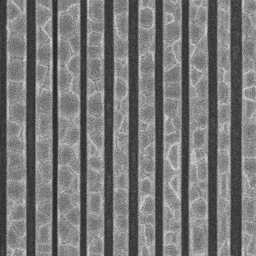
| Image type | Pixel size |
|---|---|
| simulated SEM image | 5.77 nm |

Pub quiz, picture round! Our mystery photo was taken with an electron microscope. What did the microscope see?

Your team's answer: parallel lines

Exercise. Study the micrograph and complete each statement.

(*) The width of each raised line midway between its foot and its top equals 0.101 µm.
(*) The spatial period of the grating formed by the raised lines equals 149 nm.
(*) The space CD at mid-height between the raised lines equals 8.39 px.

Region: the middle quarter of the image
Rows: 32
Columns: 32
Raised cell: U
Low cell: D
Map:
UUUUDDUUUUDDDUUUDDDUUUUDDUUUUDDU
UUUUDDUUUUDDDUUUDDDUUUUDDUUUUDDU
UUUUDDUUUUDDDUUUDDDUUUUDDUUUUDDU
UUUUDDUUUUDDDUUUDDDUUUUDDUUUUDDU
UUUUDDUUUUDDUUUUDDDUUUUDDUUUUDDU
UUUUDDUUUUDDUUUUDDDUUUUDDUUUUDDU
UUUUDDUUUUDDUUUUDDDUUUUDDUUUUDDU
UUUUDDUUUUDDUUUUDDDUUUUDDUUUUDDU
UUUUDDUUUUDDUUUUDDDUUUUDDUUUUDDU
UUUUDDUUUUDDUUUUDDDUUUUDDUUUUDDU
UUUUDDUUUUDDUUUUDDDUUUUDDUUUUDDU
UUUUDDUUUUDDUUUUDDDUUUUDDUUUUDDU
UUUUDDUUUUDDUUUUDDDUUUUDDUUUUDDD
UUUUDDUUUUDDUUUUDDDUUUUDDUUUUDDD
UUUUDDUUUUDDUUUUDDDUUUUDDUUUUDDD
UUUUDDUUUUDDUUUUDDDUUUUDDUUUUDDD
UUUUDDUUUUDDUUUUDDDUUUUDDUUUUDDD
UUUUDDUUUUDDUUUUDDDUUUUDDUUUUDDD
UUUUDDUUUUDDUUUUDDDUUUUDDUUUUDDD
UUUUDDUUUUDDUUUUDDDUUUUDDUUUUDDU
UUUUDDUUUUDDUUUUDDDUUUUDDUUUUDDU
UUUUDDUUUUDDUUUUDDDUUUUDDUUUUDDU
UUUUDDUUUUDDUUUUDDDUUUUDDUUUUDDU
UUUUDDUUUUDDUUUUDDDUUUUDDUUUUDDU
UUUUDDUUUUDDUUUUDDDUUUUDDUUUUDDU
UUUUDDUUUUDDUUUUDDDUUUUDDUUUUDDU
UUUUDDUUUUDDUUUUDDDUUUUDDUUUUDDU
UUUUDDUUUUDDUUUUDDDUUUUDDUUUUDDU
UUUUDDUUUUDDUUUUDDDUUUUDDUUUUDDU
UUUUDDUUUUDDUUUUDDDUUUUDDUUUUDDU
UUUUDDUUUUDDUUUUDDDUUUUDDUUUUDDU
UUUUDDUUUUDDUUUUDDDUUUUDDUUUUDDU